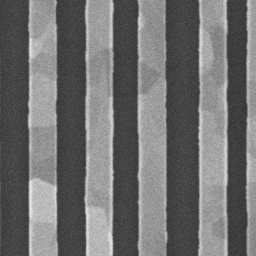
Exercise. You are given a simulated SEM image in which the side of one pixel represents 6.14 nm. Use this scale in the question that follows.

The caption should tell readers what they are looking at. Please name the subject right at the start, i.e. lines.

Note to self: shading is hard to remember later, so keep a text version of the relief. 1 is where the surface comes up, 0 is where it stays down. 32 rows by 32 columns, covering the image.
00001110000111000111100001110001
00001110000111000111100001110001
00001110000111000111100001110001
00001110000111000111100001110001
00001110000111000111100001110001
00001110000111000111100001110001
00001110000111000111100001110001
00001110000111000111100001110001
00001110000111000111100001110001
00001110000111000111100001110001
00001110000111000111100001110001
00001110000111000111100001110001
00001110000111000111100001110001
00001110000111000111100001110001
00001110000111000111100001110001
00001110000111000111100001110001
00001110000111000111100001110001
00001110000111000111100001110001
00001110000111000111100001110001
00001110000111000011100001110001
00001110000111000111100001110001
00001110000111000111100001110001
00001110000111000111100001110001
00001110000111000111100001110001
00001110000111000111100001110001
00001110000111000111100001110001
00001110000111000011100001110001
00001110000111000111100001110001
00001110000111000111100001110001
00001110000111000111100001110001
00001110000111000111100001110001
00001110000111000111100001110001